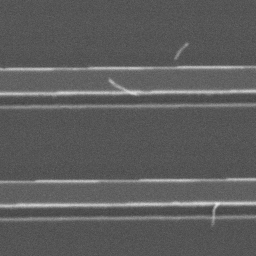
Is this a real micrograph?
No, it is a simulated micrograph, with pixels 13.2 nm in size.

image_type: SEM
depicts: lines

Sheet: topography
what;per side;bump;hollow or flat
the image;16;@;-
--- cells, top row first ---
----------------
----------------
----------------
----------------
@@@@@@@@@@@@@@@@
@@@@@@@@@@@@@@@@
----------------
----------------
----------------
----------------
----------------
@@@@@@@@@@@@@@@@
@@@@@@@@@@@@@@@@
----------------
----------------
----------------